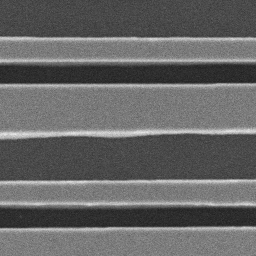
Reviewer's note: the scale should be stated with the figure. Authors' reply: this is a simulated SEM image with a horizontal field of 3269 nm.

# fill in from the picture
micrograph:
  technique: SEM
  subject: lines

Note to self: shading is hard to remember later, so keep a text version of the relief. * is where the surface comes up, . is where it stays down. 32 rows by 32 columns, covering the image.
................................
................................
................................
................................
................................
********************************
********************************
********************************
................................
................................
..............***..**.....******
********************************
********************************
********************************
********************************
********************************
***********************.........
................................
................................
................................
................................
................................
................................
********************************
********************************
********************************
................................
................................
..........**********************
********************************
********************************
********************************